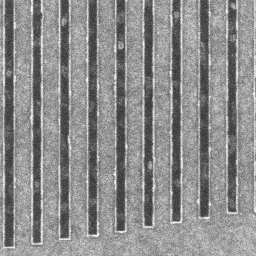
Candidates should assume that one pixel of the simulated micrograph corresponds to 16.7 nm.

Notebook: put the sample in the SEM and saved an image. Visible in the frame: parallel lines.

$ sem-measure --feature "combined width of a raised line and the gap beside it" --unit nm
465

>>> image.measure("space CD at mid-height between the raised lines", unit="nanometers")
282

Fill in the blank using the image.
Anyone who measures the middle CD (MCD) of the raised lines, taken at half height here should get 188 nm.